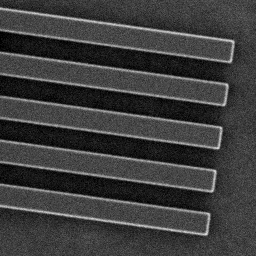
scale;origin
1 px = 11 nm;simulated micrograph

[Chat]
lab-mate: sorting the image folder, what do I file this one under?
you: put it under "groups of lines, slits or small figures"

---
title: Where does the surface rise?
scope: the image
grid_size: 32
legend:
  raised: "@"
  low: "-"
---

--------------------------------
@@@-----------------------------
@@@@@@@@@@@---------------------
@@@@@@@@@@@@@@@@@@--------------
-----@@@@@@@@@@@@@@@@@@@@-------
------------@@@@@@@@@@@@@@@@@---
-------------------@@@@@@@@@@---
@@@@@@@--------------------@@---
@@@@@@@@@@@@@@------------------
-@@@@@@@@@@@@@@@@@@@@-----------
---------@@@@@@@@@@@@@@@@@@@----
----------------@@@@@@@@@@@@----
@@@@-------------------@@@@@----
@@@@@@@@@@----------------------
@@@@@@@@@@@@@@@@@@--------------
-----@@@@@@@@@@@@@@@@@@@@-------
------------@@@@@@@@@@@@@@@@----
-------------------@@@@@@@@@----
@@@@@@@-------------------@-----
@@@@@@@@@@@@@@------------------
-@@@@@@@@@@@@@@@@@@@@-----------
--------@@@@@@@@@@@@@@@@@@@-----
----------------@@@@@@@@@@@-----
@@@@-------------------@@@@-----
@@@@@@@@@@@---------------------
@@@@@@@@@@@@@@@@@@--------------
-----@@@@@@@@@@@@@@@@@@@@-------
------------@@@@@@@@@@@@@@------
-------------------@@@@@@@------
--------------------------------
--------------------------------
--------------------------------